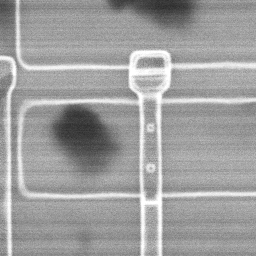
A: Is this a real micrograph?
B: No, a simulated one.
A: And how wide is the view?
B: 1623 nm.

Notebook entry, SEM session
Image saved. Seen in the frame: wiring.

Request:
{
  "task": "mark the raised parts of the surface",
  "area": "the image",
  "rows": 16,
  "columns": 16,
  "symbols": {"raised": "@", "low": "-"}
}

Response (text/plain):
-@@@@@@@@@@@@@@@
-@@@@@@@@@@@@@@@
-@@@@@@@@@@@@@@@
-@@@@@@@@@@@@@@@
@-------@@@-----
@-------@@------
@-@@@@@@@@@@@@@@
@@@@@@@@@@@@@@@@
@@@@@@@@@@@@@@@@
@@@@@@@@@@@@@@@@
@@@@@@@@@@@@@@@@
@@@@@@@@@@@@@@@@
@--------@------
@--------@------
@--------@------
@--------@------